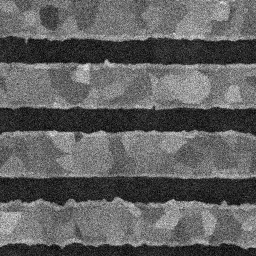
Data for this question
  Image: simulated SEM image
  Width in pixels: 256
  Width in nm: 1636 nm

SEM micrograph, one or a few lines or trenches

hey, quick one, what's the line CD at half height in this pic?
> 267 nm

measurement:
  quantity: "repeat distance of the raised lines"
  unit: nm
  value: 440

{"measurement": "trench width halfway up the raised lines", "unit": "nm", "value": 171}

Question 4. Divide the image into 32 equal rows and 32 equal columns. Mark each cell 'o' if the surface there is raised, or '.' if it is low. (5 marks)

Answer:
oooooooooooooooooooooooooooooooo
oooooooooooooooooooooooooooooooo
oooooooooooooooooooooooooooooooo
oooooooooooooooooooooooooooooooo
...ooooooooooooooooooooooooooooo
................................
................................
................................
oooooooooooooooooooooooooooooooo
oooooooooooooooooooooooooooooooo
oooooooooooooooooooooooooooooooo
oooooooooooooooooooooooooooooooo
oooooooooooooooooooooooooooooooo
....................o...........
................................
................................
.....oo.................o.......
oooooooooooooooooooooooooooooooo
oooooooooooooooooooooooooooooooo
oooooooooooooooooooooooooooooooo
oooooooooooooooooooooooooooooooo
oooooooooooooooooooooooooooooooo
................................
................................
................................
.oooooo..ooooooo.o..oo.ooo......
oooooooooooooooooooooooooooooooo
oooooooooooooooooooooooooooooooo
oooooooooooooooooooooooooooooooo
oooooooooooooooooooooooooooooooo
......oo...o..o...oooooooooo.ooo
................................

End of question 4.